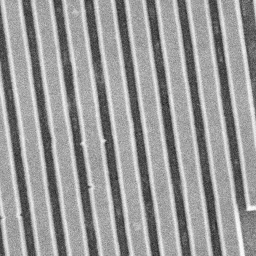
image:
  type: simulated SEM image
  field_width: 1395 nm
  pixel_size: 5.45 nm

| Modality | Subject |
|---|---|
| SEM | parallel lines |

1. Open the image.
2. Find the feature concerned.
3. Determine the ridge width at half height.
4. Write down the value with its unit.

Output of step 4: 104 nanometres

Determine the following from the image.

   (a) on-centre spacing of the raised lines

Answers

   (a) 167 nanometers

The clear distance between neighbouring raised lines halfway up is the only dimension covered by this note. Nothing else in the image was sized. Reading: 62.7 nm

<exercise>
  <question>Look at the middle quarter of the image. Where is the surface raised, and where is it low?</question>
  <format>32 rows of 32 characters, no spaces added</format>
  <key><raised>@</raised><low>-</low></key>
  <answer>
--@@@@@---@@@@@---@@@@---@@@@@--
--@@@@@---@@@@@---@@@@@---@@@@--
---@@@@---@@@@@---@@@@@---@@@@--
---@@@@---@@@@@---@@@@@---@@@@@-
---@@@@@---@@@@---@@@@@---@@@@@-
---@@@@@---@@@@---@@@@@---@@@@@-
---@@@@@---@@@@@---@@@@---@@@@@-
---@@@@@---@@@@@---@@@@---@@@@@-
---@@@@@---@@@@@---@@@@@---@@@@-
---@@@@@---@@@@@---@@@@@---@@@@-
---@@@@@---@@@@@---@@@@@---@@@@@
@---@@@@@---@@@@---@@@@@---@@@@@
@---@@@@@---@@@@---@@@@@---@@@@@
@---@@@@@---@@@@@---@@@@---@@@@@
@---@@@@@---@@@@@---@@@@---@@@@@
@---@@@@@---@@@@@---@@@@@---@@@@
@@---@@@@---@@@@@---@@@@@---@@@@
@@---@@@@---@@@@@---@@@@@---@@@@
@@---@@@@@---@@@@---@@@@@---@@@@
@@---@@@@@---@@@@---@@@@@---@@@@
@@---@@@@@---@@@@@---@@@@---@@@@
@@---@@@@@---@@@@@---@@@@---@@@@
@@---@@@@@---@@@@@---@@@@@---@@@
@@@--@@@@@---@@@@@---@@@@@---@@@
@@@--@@@@@---@@@@@---@@@@@---@@@
@@@---@@@@@---@@@@---@@@@@---@@@
@@@---@@@@@---@@@@---@@@@@---@@@
@@@---@@@@@---@@@@@---@@@@---@@@
@@@---@@@@@---@@@@@---@@@@----@@
@@@---@@@@@---@@@@@---@@@@@---@@
@@@@---@@@@---@@@@@---@@@@@---@@
@@@@---@@@@---@@@@@---@@@@@---@@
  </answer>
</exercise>